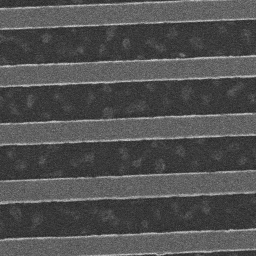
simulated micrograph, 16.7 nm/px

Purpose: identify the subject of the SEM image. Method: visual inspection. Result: parallel lines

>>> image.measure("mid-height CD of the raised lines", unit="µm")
0.352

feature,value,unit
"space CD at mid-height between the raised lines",615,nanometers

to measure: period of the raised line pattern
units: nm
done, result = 964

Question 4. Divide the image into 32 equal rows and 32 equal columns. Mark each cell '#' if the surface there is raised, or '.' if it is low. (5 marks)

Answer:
...............#################
################################
##########################......
##..............................
................................
................................
................................
....................#.##########
################################
################################
######..........................
................................
................................
................................
........................########
.###############################
################################
###############.................
................................
................................
................................
..............................##
.....###########################
################################
#####################...........
................................
................................
................................
................................
............####################
################################
#######################.........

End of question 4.